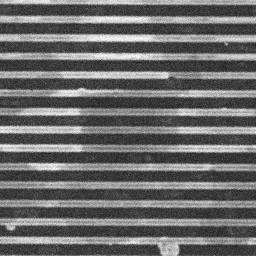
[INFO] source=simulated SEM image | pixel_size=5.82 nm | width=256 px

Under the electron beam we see parallel lines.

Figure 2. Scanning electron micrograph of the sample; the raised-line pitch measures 107 nanometers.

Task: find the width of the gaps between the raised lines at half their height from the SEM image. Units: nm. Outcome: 72.1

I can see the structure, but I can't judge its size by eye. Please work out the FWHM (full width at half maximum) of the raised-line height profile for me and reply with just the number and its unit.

33.5 nm